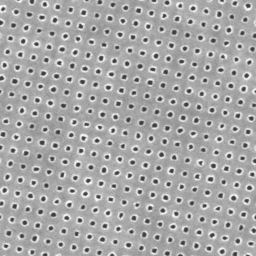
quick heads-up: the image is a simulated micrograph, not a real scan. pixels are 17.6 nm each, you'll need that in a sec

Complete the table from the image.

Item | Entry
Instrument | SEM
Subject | a regular array of holes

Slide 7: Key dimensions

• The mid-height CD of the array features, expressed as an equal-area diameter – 86.4 nanometres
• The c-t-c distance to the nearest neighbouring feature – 13.1 pixels